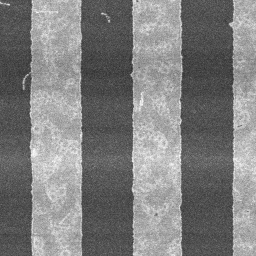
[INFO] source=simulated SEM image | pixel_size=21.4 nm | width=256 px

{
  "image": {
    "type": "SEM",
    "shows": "one or a few lines or trenches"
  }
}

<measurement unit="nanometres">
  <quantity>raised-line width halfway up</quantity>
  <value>1030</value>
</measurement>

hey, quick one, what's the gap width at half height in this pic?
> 1130 nanometers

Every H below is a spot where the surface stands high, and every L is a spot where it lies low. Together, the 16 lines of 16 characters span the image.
LLHHHLLLHHHLLLLH
LLHHHLLLHHHLLLLH
LLHHHLLLHHHLLLLH
LLHHHLLLHHHLLLLH
LLHHHLLLHHHLLLLH
LLHHHLLLHHHLLLLH
LLHHHLLLHHHLLLLH
LLHHHLLLHHHLLLLH
LLHHHLLLHHHLLLLH
LLHHHLLLHHHLLLLH
LLHHHLLLHHHLLLLH
LLHHHLLLHHHLLLLH
LLHHHLLLHHHLLLLH
LLHHHLLLHHHLLLLH
LLHHHLLLHHHLLLLH
LLHHHLLLHHHLLLLH